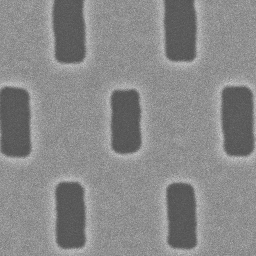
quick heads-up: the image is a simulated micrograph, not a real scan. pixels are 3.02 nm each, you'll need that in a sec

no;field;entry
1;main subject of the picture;holes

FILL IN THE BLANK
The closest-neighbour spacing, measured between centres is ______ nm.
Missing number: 332